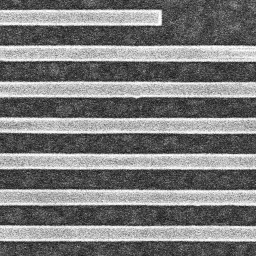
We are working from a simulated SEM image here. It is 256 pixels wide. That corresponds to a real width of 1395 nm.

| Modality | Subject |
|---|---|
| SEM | parallel lines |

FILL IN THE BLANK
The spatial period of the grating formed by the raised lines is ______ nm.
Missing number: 196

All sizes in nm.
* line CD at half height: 76.2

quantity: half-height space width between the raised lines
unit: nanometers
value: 118